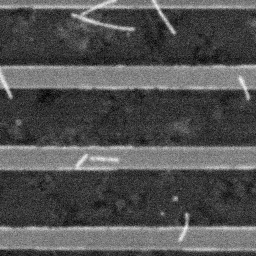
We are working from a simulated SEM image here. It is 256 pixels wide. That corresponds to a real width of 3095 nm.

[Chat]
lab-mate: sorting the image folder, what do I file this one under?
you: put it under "lines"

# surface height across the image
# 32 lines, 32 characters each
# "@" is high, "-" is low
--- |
@@@@@@@@@@@@@@@@@@@@@@@@@@@@@@@@
--------------------------------
--------------------------------
--------------------------------
--------------------------------
--------------------------------
--------------------------------
--------------------------------
@@@@@@@@@@@@@@@@@@@@@@@@@@@@@@@@
@@@@@@@@@@@@@@@@@@@@@@@@@@@@@@@@
@@@@@@@@@@@@@@@@@@@@@@@@@@@@@@@@
--------------------------------
--------------------------------
--------------------------------
--------------------------------
--------------------------------
--------------------------------
--------------------------------
@@@@@@@@@@@@@@@@@@@@@@@@@@@@@@@@
@@@@@@@@@@@@@@@@@@@@@@@@@@@@@@@@
@@@@@@@@@@@@@@@@@@@@@@@@@@@@@@@@
--------------------------------
--------------------------------
--------------------------------
--------------------------------
--------------------------------
--------------------------------
--------------------------------
@@-@@@-@@@@@@@@@@@@-@@@@@@@@@@@@
@@@@@@@@@@@@@@@@@@@@@@@@@@@@@@@@
@@@@@@@@@@@@@@@@@@@@@@@@@@@@@@@@
--------------------------------